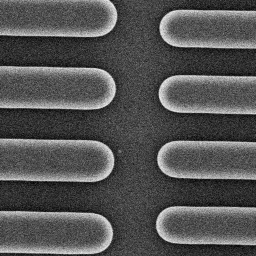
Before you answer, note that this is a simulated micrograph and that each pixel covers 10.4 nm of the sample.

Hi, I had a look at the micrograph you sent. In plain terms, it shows groups of lines, slits or small figures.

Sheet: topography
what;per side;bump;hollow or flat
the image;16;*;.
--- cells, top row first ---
*******.........
*******...******
..........******
................
*******.........
*******...******
*******...******
................
................
*******...******
*******...******
................
................
******....******
*******...******
*******.........